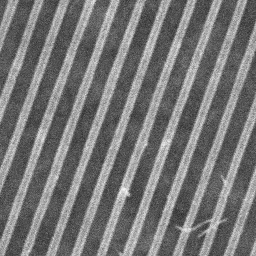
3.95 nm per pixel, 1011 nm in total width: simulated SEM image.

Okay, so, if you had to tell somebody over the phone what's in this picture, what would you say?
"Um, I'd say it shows parallel lines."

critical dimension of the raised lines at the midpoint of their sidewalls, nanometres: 26.5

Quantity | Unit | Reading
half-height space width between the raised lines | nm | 67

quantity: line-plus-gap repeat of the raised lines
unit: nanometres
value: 94.7